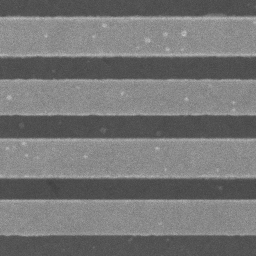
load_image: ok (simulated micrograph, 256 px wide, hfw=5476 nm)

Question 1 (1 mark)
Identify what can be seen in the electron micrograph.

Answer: lines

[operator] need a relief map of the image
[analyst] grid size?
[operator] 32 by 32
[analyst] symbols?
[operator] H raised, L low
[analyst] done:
LLLLLLLLLLLLLLLLLLLLLLLLLLLLLLLL
LLLLLLLLLLLLLLLLLLLLLLLLLLLLLLLL
HHHHHHHHHHHHHHHHHHHHHHHHHHHHHHHH
HHHHHHHHHHHHHHHHHHHHHHHHHHHHHHHH
HHHHHHHHHHHHHHHHHHHHHHHHHHHHHHHH
HHHHHHHHHHHHHHHHHHHHHHHHHHHHHHHH
HHHHHHHHHHHHHHHHHHHHHHHHHHHHHHHH
LLLLLLLLLLLLLLLLLLLLLLLLLLLLLLLL
LLLLLLLLLLLLLLLLLLLLLLLLLLLLLLLL
LLLLLLLLLLLLLLLLLLLLLLLLLLLLLLLL
HHHHHHHHHHHHHHHHHHHHHHHHHHHHHHHH
HHHHHHHHHHHHHHHHHHHHHHHHHHHHHHHH
HHHHHHHHHHHHHHHHHHHHHHHHHHHHHHHH
HHHHHHHHHHHHHHHHHHHHHHHHHHHHHHHH
LLLLLLLLLLLLLLLLLLLLLLLLLLLLLLLL
LLLLLLLLLLLLLLLLLLLLLLLLLLLLLLLL
LLLLLLLLLLLLLLLLLLLLLLLLLLLLLLLL
HHHHHHHHHHHHHHHHHHHHHHHHHHHHHHHH
HHHHHHHHHHHHHHHHHHHHHHHHHHHHHHHH
HHHHHHHHHHHHHHHHHHHHHHHHHHHHHHHH
HHHHHHHHHHHHHHHHHHHHHHHHHHHHHHHH
HHHHHHHHHHHHHHHHHHHHHHHHHHHHHHHH
LLLLLLLLLLLLLLLLLLLLLLLLLLLLLLLL
LLLLLLLLLLLLLLLLLLLLLLLLLLLLLLLL
LLLLLLLLLLLLLLLLLLLLLLLLLLLLLLLL
HHHHHHHHHHHHHHHHHHHHHHHHHHHHHHHH
HHHHHHHHHHHHHHHHHHHHHHHHHHHHHHHH
HHHHHHHHHHHHHHHHHHHHHHHHHHHHHHHH
HHHHHHHHHHHHHHHHHHHHHHHHHHHHHHHH
LLLLLLLLLLLLLLLLLLLLLLLLLLLLLLLL
LLLLLLLLLLLLLLLLLLLLLLLLLLLLLLLL
LLLLLLLLLLLLLLLLLLLLLLLLLLLLLLLL